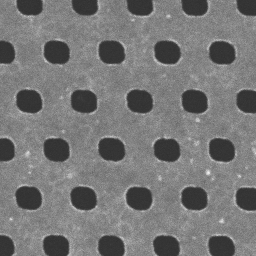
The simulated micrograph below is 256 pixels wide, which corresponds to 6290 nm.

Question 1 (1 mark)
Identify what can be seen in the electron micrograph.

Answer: a regular array of holes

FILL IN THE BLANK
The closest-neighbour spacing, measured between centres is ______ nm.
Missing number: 1350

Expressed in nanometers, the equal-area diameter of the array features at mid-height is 645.